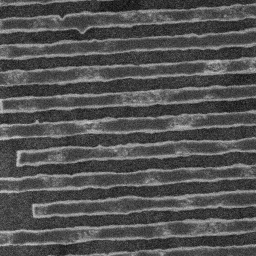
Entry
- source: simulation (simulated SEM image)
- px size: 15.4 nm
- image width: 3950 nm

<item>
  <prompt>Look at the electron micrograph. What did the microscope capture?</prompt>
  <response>parallel lines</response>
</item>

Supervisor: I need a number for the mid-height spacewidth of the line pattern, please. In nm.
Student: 195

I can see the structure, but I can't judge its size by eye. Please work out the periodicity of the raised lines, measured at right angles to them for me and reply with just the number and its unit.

411 nm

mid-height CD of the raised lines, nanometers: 208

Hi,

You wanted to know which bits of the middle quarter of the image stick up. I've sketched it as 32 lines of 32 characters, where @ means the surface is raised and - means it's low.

------------@@-@@--@@@@@@@@@@@@@
@@@@@@@@@@@@@@@@@@@@@@@@@@@@@@@@
@@@@@@@@@@@@@@@@@@@@@@@@@@@@@@@@
@@@@@@@@@@@@@@@--@@@@@----------
--------------------------------
--------------------------------
---------------------@---@@@@@@@
-----------@@@@@@@@@@@@@@@@@@@@@
@@@@@@@@@@@@@@@@@@@@@@@@@@@@@@@@
@@@@@@@@@@@@@@@@@@@@@@@@@@@@@@@-
@@@@@@@@@@----------------------
--------------------------------
--------------------------------
-------------@@--@@--@-@@@@@@@@@
@@@@@@@@@@@@@@@@@@@@@@@@@@@@@@@@
@@@@@@@@@@@@@@@@@@@@@@@@@@@@@@@@
@@@@@@@@@@@@@@@@@@@@@@@@@@@-----
@@@@@---------------------------
--------------------------------
---------------------------@@@@@
--------------@-@@@@@@@@@@@@@@@@
@@@@@@@@@@@@@@@@@@@@@@@@@@@@@@@@
@@@@@@@@@@@@@@@@@@@@@@@@@@@@@@@@
@@@@@@@@@@@@@@@@@@@-------------
@@@-----------------------------
--------------------------------
----------------------@---@@@@@@
----@@@@@@@@@@@@@@@@@@@@@@@@@@@@
@@@@@@@@@@@@@@@@@@@@@@@@@@@@@@@@
@@@@@@@@@@@@@@@@@@@@@@@@@@@@@---
@@@@@@@@@@@@@-------------------
--------------------------------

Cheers